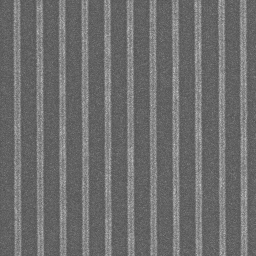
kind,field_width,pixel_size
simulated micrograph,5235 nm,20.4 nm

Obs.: parallel lines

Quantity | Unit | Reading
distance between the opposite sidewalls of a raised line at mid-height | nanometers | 105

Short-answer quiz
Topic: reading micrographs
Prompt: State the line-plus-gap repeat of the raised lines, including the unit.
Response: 0.463 microns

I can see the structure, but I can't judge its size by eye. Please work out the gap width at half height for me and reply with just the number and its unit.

350 nm